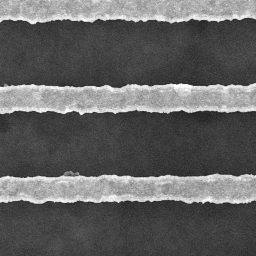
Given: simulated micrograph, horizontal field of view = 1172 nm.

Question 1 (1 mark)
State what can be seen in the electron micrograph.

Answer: lines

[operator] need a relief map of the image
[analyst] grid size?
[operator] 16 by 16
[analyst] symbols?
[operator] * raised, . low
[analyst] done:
****************
................
................
................
................
****************
****************
................
................
................
................
****************
**********.*****
................
................
................